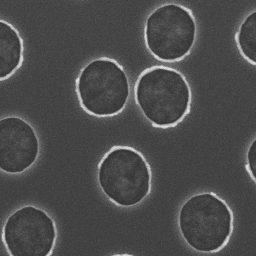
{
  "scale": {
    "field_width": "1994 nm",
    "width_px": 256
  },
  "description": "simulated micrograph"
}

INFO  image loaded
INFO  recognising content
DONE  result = holes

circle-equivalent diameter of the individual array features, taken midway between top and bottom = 408 nm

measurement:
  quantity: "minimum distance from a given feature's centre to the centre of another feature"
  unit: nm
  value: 501